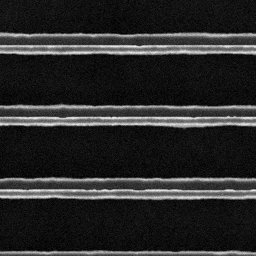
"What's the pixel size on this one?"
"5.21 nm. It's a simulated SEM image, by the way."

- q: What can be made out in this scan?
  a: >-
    lines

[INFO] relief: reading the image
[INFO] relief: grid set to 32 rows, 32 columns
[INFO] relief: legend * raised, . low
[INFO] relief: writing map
................................
................................
................................
................................
***************.****************
********************************
********************************
................................
................................
................................
................................
................................
................................
********************************
********************************
************.***************.***
................................
................................
................................
................................
................................
................................
***.****..********************.*
********************************
********************************
................................
................................
................................
................................
................................
................................
...................*............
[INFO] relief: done